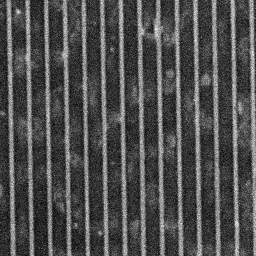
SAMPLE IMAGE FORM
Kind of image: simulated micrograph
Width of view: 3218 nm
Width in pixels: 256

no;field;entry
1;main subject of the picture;parallel lines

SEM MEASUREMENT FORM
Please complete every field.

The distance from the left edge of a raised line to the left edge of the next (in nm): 235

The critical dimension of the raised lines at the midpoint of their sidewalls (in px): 2.63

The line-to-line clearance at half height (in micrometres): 0.196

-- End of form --